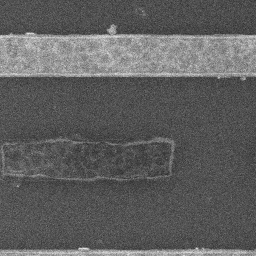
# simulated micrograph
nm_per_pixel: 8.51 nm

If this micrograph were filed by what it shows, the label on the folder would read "one or a few lines or trenches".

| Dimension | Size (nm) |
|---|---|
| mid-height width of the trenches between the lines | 606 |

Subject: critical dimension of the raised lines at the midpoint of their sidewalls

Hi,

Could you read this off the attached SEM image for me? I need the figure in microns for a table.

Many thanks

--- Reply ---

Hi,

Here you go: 0.308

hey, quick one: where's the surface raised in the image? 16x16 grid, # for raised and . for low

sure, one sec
................
................
################
################
################
................
................
................
................
###########.....
###########.....
................
................
................
................
................